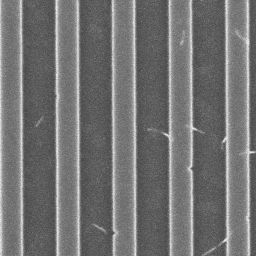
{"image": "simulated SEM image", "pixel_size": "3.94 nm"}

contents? parallel lines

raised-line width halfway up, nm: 83.8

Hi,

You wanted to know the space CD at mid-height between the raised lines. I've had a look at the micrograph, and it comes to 0.139 microns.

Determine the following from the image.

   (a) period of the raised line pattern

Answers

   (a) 0.223 micrometres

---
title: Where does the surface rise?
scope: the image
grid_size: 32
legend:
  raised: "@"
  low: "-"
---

@@@----@@@----@@@----@@@----@@@-
@@@----@@@----@@@----@@@----@@@-
@@@----@@@----@@@----@@@----@@@-
@@@----@@@----@@@----@@@----@@@-
@@@----@@@----@@@----@@@----@@@-
@@@----@@@----@@@----@@@----@@@-
@@@----@@@----@@@----@@@----@@@-
@@@----@@@----@@@----@@@----@@@-
@@@----@@@----@@@----@@@----@@@-
@@@----@@@----@@@----@@@----@@@-
@@@----@@@----@@@----@@@----@@@-
@@@----@@@----@@@----@@@----@@@-
@@@----@@@----@@@----@@@----@@@-
@@@----@@@----@@@----@@@----@@@-
@@@----@@@----@@@----@@@----@@@-
@@@----@@@----@@@----@@@----@@@-
@@@----@@@----@@@----@@@----@@@-
@@@----@@@----@@@----@@@----@@@-
@@@----@@@----@@@----@@@----@@@-
@@@----@@@----@@@----@@@----@@@-
@@@----@@@----@@@----@@@----@@@-
@@@----@@@----@@@----@@@----@@@-
@@@----@@@----@@@----@@@----@@@-
@@@----@@@----@@@----@@@----@@@-
@@@----@@@----@@@----@@@----@@@-
@@@----@@@----@@@----@@@----@@@-
@@@----@@@----@@@----@@@----@@@-
@@@----@@@----@@@----@@@----@@@-
@@@----@@@----@@@----@@@----@@@-
@@@----@@@----@@@----@@@----@@@-
@@@----@@@----@@@----@@@----@@@-
@@@----@@@----@@@----@@@----@@@-